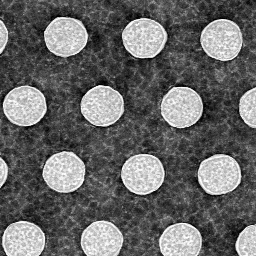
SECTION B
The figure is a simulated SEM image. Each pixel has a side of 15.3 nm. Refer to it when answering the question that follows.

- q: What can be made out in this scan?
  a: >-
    a regular array of raised bodies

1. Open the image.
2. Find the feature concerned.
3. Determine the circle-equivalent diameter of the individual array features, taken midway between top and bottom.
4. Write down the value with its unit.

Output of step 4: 0.63 microns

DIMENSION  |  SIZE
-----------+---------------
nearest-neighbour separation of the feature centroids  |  77 px